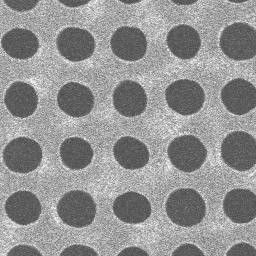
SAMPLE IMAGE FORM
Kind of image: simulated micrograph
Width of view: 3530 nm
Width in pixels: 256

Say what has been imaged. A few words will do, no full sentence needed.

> a regular array of holes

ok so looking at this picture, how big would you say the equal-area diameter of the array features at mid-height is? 501 nm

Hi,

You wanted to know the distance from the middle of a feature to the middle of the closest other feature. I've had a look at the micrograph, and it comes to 746 nanometres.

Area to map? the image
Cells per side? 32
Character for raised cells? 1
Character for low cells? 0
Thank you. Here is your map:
10000111000111111111110011111111
11111111111111111111111111111111
11111111111111111111111111111111
11011111001111100111110011110000
00001110000011000011100001110000
00000110000011000011100001100000
10000110000011000011100001110000
11111111001111100111111111111001
11111111111111111111111111111111
11111111111111111111111111111111
11001111001111100111100001110001
10001110000111000011100000110000
00000110000011000011100000110000
10000110000011000011100001110000
11001111100111110111111111111111
11111111111111111111111111111111
11111111111111111111111111111001
11001111000111100111110001110000
10000110000111000011100000110000
00000110000011000001100000110000
10000111000111100011110001110000
11001111111111111111111011111111
11111111111111111111111111111111
11111111111111111111111111111111
10001111000111100011100001110000
10000110000011000001100000110000
10000110000011000001100000110000
10000111000011100011100001111000
11111111111111111111111111111111
11111111111111111111111111111111
11111111111111111111111111111101
10000111000011100011110001110000